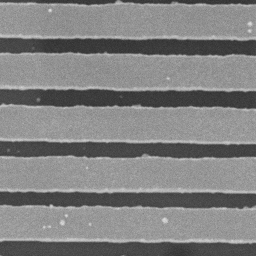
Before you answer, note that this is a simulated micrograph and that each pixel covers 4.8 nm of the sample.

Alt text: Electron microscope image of lines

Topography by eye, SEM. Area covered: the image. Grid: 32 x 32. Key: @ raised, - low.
@@@@@---------@@@---------------
@@@@@@@@@@@@@@@@@@@@@@@@@@@@@@@@
@@@@@@@@@@@@@@@@@@@@@@@@@@@@@@@@
@@@@@@@@@@@@@@@@@@@@@@@@@@@@@@@@
@@@@@@@@@@@@@@@@@@@@@@@@@@@@@@@@
--------------------------------
--------------------------------
@@@@@@@@@@@@@@@@@@@@@@@@@@@@@@@@
@@@@@@@@@@@@@@@@@@@@@@@@@@@@@@@@
@@@@@@@@@@@@@@@@@@@@@@@@@@@@@@@@
@@@@@@@@@@@@@@@@@@@@@@@@@@@@@@@@
--------------------------------
--------------------------------
@@@@@@@@@@@@@@@@@@@-@@@@@@@@@---
@@@@@@@@@@@@@@@@@@@@@@@@@@@@@@@@
@@@@@@@@@@@@@@@@@@@@@@@@@@@@@@@@
@@@@@@@@@@@@@@@@@@@@@@@@@@@@@@@@
@@@@@@@@@@@@@@@@@@@@@@@@@@@@@@@@
--------------------------------
--------@-----------------------
@@@@@@@@@@@@@@@@@@@@@@@@@@@@@@@@
@@@@@@@@@@@@@@@@@@@@@@@@@@@@@@@@
@@@@@@@@@@@@@@@@@@@@@@@@@@@@@@@@
@@@@@@@@@@@@@@@@@@@@@@@@@@@@@@@@
--------------------------------
--------------------------------
@@@@@@@@@@@@@@@@@@@@@@@@@@@@@@@@
@@@@@@@@@@@@@@@@@@@@@@@@@@@@@@@@
@@@@@@@@@@@@@@@@@@@@@@@@@@@@@@@@
@@@@@@@@@@@@@@@@@@@@@@@@@@@@@@@@
--------------------------------
--------------------------------